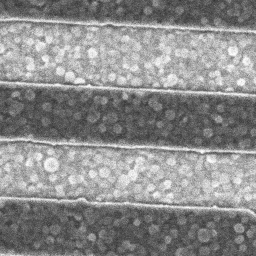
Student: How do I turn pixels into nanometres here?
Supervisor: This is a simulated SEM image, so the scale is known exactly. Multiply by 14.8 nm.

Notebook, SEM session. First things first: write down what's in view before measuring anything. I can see one or a few lines or trenches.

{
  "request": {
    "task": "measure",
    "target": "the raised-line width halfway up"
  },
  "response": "0.866 µm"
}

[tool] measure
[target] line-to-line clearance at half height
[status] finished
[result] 853 nm